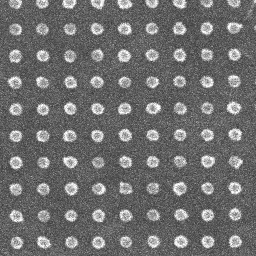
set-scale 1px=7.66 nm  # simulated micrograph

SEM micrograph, a regular array of raised bodies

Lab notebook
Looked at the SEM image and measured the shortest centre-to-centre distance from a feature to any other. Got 0.203 micrometres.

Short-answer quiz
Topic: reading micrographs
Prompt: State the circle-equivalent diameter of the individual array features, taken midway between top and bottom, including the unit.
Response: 0.0894 microns